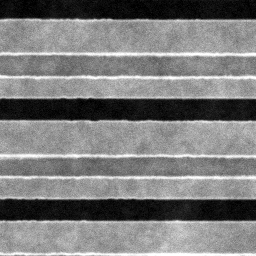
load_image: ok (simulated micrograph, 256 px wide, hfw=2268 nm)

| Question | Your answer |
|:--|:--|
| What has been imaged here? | lines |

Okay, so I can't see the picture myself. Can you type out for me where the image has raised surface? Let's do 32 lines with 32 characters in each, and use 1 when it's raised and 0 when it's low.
00000000000000000000000000000000
00000000000000000000000000000000
11111111110111000110001010000010
11111111111111111111111111111111
11111111111111111111111111111111
11111111111111111111111111111111
11111111111111111111111111111111
11111111111111111111111111111111
11111111111111111111111111111111
11111111111111111111111111111111
11111111111111111111111111111111
11111111111111111111111111111111
00000000000000000000000000000000
00000000000000000000000000000000
00000000000000000000000000000000
11111111111111111111111111111111
11111111111111111111111111111111
11111111111111111111111111111111
11111111111111111111111111111111
11111111111111111111111111111111
11111111111111111111111111111111
11111111111111111111111111111111
11111111111111111111111111111111
11111111111111111111111111111111
11111111111111111111111111111111
00000000000000000000000000000000
00000000000000000000000000000000
00000000000000000000000000000000
11111111111111111111111111111111
11111111111111111111111111111111
11111111111111111111111111111111
11111111111111111111111111111111